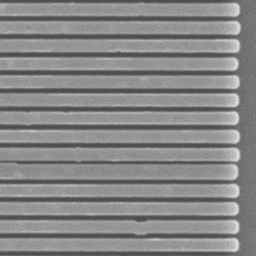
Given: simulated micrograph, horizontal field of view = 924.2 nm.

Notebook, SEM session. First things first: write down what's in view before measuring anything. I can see parallel lines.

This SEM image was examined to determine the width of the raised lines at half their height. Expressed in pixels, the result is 13.1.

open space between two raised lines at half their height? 0.0189 micrometres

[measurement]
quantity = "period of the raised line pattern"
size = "65.3 nm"